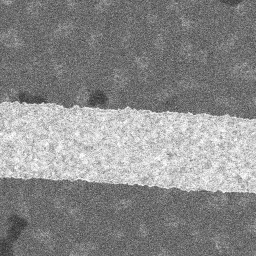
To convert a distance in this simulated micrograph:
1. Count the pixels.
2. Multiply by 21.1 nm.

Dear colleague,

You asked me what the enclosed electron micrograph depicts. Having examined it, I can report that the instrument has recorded one or a few lines or trenches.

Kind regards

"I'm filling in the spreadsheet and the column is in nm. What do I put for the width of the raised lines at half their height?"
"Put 1570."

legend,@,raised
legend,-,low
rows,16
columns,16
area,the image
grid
----------------
----------------
----------------
----------------
----------------
----------------
@@--------------
@@@@@@@@@@@@@@@@
@@@@@@@@@@@@@@@@
@@@@@@@@@@@@@@@@
@@@@@@@@@@@@@@@@
--------@@@@@@@@
----------------
----------------
----------------
----------------